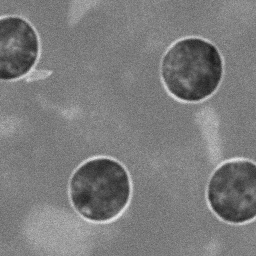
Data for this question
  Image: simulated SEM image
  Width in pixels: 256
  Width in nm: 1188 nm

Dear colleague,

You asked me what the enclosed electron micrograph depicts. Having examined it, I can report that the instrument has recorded holes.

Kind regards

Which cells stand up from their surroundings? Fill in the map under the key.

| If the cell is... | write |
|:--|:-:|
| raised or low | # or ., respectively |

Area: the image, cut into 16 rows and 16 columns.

################
..##############
..#########..###
..########....##
..########....##
##########...###
################
################
################
################
#####...######..
####....#####...
#####...#####...
#####..#######..
################
################